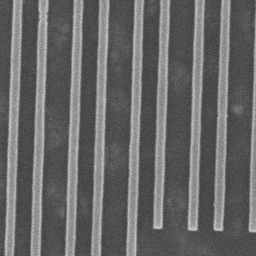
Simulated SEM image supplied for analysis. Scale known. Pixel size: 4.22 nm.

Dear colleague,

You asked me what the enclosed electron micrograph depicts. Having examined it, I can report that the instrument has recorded parallel lines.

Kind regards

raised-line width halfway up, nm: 34.3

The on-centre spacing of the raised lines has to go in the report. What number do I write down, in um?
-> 0.126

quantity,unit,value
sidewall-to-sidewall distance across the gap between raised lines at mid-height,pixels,25.1